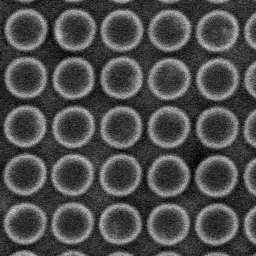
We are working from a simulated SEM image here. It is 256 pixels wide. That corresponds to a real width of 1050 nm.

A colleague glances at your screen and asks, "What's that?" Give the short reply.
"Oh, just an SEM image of a regular array of raised bodies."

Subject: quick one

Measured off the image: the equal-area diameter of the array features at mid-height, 39.5 px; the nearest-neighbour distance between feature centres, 196 nm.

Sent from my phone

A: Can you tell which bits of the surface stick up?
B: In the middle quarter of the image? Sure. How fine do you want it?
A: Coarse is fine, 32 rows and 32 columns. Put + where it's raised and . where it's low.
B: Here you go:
++++++.....+++++++.....+++++++..
+++++++...+++++++++...+++++++++.
+++++++...+++++++++...+++++++++.
+++++++...+++++++++..++++++++++.
+++++++...+++++++++..++++++++++.
+++++++...+++++++++...+++++++++.
++++++....++++++++....++++++++..
+++++.......+++++......++++++...
.........................++.....
................................
................................
+++++.......+++++.......+++++...
++++++.....+++++++.....+++++++..
+++++++...+++++++++...+++++++++.
+++++++...+++++++++..++++++++++.
+++++++..++++++++++..++++++++++.
+++++++..++++++++++..++++++++++.
+++++++...+++++++++..++++++++++.
++++++....++++++++....++++++++..
+++++......++++++......++++++...
.............+++.........++.....
................................
................................
+++++.......+++++.......++++....
++++++.....+++++++.....++++++...
+++++++...+++++++++...++++++++..
+++++++...+++++++++...+++++++++.
+++++++..++++++++++..++++++++++.
+++++++..++++++++++..++++++++++.
+++++++..++++++++++..++++++++++.
++++++....++++++++....++++++++..
+++++......++++++.....+++++++...